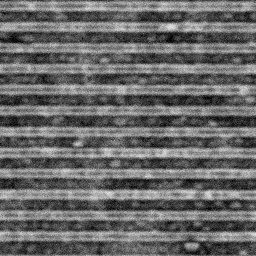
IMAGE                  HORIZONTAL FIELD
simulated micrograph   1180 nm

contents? parallel lines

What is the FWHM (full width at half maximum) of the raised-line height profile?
38.6 nanometers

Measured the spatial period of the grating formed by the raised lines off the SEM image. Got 96.3 nanometres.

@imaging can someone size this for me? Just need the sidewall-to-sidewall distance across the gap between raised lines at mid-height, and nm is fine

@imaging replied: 58.7